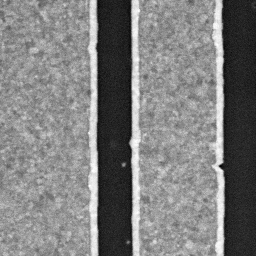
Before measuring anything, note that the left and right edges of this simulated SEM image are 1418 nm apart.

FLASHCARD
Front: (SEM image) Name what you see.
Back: one or a few lines or trenches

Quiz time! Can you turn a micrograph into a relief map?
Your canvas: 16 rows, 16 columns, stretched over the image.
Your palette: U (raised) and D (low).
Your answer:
UUUUUUDDUUUUUUDD
UUUUUUDDUUUUUUDD
UUUUUUDDUUUUUUDD
UUUUUUDDUUUUUUDD
UUUUUUDDUUUUUUDD
UUUUUUDDUUUUUUDD
UUUUUUDDUUUUUUDD
UUUUUUDDUUUUUUDD
UUUUUUDDUUUUUUDD
UUUUUUDDUUUUUUDD
UUUUUUDDUUUUUUDD
UUUUUUDDDUUUUUDD
UUUUUUDDDUUUUUDD
UUUUUUDDUUUUUUDD
UUUUUUDDDUUUUUDD
UUUUUUDDDUUUUUDD